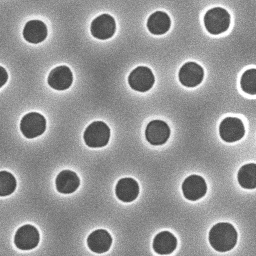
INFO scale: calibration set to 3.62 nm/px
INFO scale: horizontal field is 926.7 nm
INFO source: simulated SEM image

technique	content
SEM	a regular array of holes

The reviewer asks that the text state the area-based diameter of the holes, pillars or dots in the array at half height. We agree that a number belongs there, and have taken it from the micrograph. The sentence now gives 0.096 microns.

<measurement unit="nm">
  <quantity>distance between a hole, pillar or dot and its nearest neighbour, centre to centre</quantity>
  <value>202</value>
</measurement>